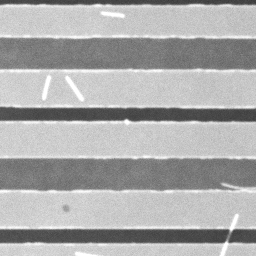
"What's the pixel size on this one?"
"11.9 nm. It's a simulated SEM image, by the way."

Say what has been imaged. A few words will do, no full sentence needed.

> lines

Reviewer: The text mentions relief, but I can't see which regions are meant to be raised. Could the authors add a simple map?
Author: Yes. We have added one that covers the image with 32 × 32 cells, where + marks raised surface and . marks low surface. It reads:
................................
++++++++++++++++++++++++++++++++
++++++++++++++++++++++++++++++++
++++++++++++++++++++++++++++++++
++++++++++++++++++++++++++++++++
................................
................................
................................
................................
++++++++++++++++++++++++++++++++
++++++++++++++++++++++++++++++++
++++++++++++++++++++++++++++++++
++++++++++++++++++++++++++++++++
................................
................................
++++++++++++++++++++++++++++++++
++++++++++++++++++++++++++++++++
++++++++++++++++++++++++++++++++
++++++++++++++++++++++++++++++++
++++++++++++++++++++++++++++++++
................................
................................
................................
................................
++++++++++++++++++++++++++++++++
++++++++++++++++++++++++++++++++
++++++++++++++++++++++++++++++++
++++++++++++++++++++++++++++++++
++++++++++++++++++++++++++++++++
................................
...+++.....+....+........+..+++.
++++++++++++++++++++++++++++++++